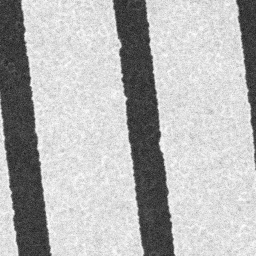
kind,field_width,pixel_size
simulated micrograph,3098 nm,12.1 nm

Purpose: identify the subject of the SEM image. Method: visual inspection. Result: one or a few lines or trenches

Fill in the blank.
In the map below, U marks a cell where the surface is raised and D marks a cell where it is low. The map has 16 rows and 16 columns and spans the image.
DUUUUUUDDUUUUUUD
DDUUUUUDDUUUUUUD
DDUUUUUDDUUUUUUD
DDUUUUUDDDUUUUUD
DDUUUUUUDDUUUUUD
DDUUUUUUDDUUUUUD
DDUUUUUUDDUUUUUU
DDUUUUUUDDUUUUUU
DDUUUUUUDDUUUUUU
DDUUUUUUDDUUUUUU
DDDUUUUUDDUUUUUU
UDDUUUUUDDUUUUUU
UDDUUUUUDDDUUUUU
UDDUUUUUUDDUUUUU
UDDUUUUUUDDUUUUU
UDDUUUUUUDDUUUUU